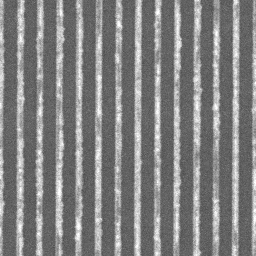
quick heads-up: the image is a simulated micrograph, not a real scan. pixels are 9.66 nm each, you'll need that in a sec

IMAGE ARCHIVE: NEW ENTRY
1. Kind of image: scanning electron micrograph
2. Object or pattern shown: parallel lines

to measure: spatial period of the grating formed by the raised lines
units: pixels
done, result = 19.6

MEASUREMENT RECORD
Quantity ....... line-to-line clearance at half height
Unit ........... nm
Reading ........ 135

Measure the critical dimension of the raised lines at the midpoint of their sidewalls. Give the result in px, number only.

5.25